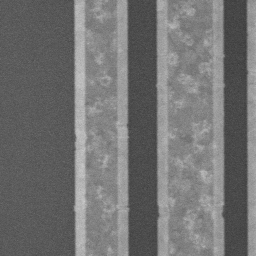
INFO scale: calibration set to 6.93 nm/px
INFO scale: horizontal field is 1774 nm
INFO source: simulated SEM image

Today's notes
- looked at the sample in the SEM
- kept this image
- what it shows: one or a few lines or trenches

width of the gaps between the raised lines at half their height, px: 37.8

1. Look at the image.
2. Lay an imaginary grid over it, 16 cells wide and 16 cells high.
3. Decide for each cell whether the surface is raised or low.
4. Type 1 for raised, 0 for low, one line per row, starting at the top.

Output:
0000011100111100
0000011100111100
0000011100111100
0000011100111100
0000011100111100
0000011100111100
0000011100111100
0000011100111100
0000011100111100
0000011100111100
0000011100111100
0000011100111100
0000011100111100
0000011100111100
0000011100111100
0000011100111100